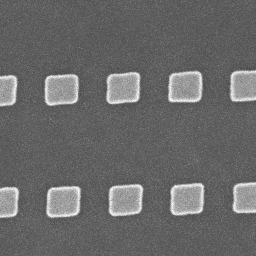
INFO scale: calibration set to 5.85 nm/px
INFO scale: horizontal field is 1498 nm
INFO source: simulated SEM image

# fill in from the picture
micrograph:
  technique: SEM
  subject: raised bodies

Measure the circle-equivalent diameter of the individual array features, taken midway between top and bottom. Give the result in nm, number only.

195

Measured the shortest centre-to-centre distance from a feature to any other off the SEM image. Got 61.8 px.